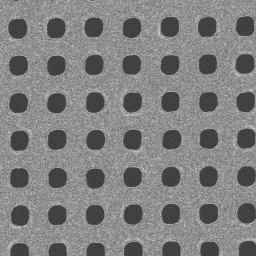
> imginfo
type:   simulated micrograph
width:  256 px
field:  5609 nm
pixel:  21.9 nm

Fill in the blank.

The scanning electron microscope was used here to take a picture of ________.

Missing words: a regular array of holes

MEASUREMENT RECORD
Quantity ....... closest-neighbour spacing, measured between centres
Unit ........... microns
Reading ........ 0.811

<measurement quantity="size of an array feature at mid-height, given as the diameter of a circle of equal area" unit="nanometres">440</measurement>